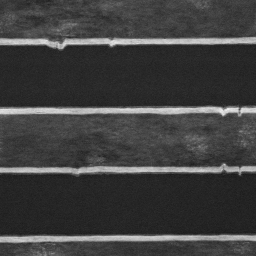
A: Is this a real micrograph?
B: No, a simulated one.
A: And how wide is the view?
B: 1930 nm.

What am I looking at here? one or a few lines or trenches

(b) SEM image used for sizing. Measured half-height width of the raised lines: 454 nm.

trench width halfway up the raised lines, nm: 512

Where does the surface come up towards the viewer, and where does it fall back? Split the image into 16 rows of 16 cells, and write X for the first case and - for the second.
XXXXXXXXXXXXXXXX
XXXXXXXXXXXXXXXX
XXXXXXXXXXXXXXXX
----------------
----------------
----------------
----------------
XXXXXXXXXXXXXXXX
XXXXXXXXXXXXXXXX
XXXXXXXXXXXXXXXX
XXXXXXXXXXXXXXXX
----------------
----------------
----------------
----------------
XXXXXXXXXXXXXXXX